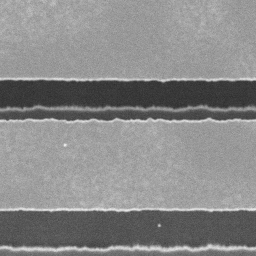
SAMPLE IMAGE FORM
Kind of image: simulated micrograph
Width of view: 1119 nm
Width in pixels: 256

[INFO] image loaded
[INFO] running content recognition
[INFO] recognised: lines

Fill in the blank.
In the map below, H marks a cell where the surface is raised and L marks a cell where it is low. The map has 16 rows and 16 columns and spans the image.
HHHHHHHHHHHHHHHH
HHHHHHHHHHHHHHHH
HHHHHHHHHHHHHHHH
HHHHHHHHHHHHHHHH
HHHHHHHHHHHHHHHH
LLLLLLLLLLLLLLLL
LLLLLLLLLLLLLLLL
LHHHLHLHHHHLHHHH
HHHHHHHHHHHHHHHH
HHHHHHHHHHHHHHHH
HHHHHHHHHHHHHHHH
HHHHHHHHHHHHHHHH
HHHHHHHHHHHHHHHH
LLLLLLLLLLLLLLLL
LLLLLLLLLLLLLLLL
LLLLLLLLLLLLLLLL